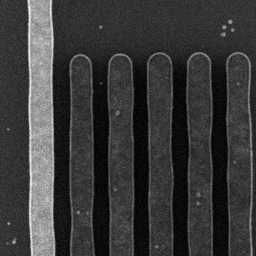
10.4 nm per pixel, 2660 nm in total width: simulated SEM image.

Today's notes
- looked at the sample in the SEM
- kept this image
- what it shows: groups of lines, slits or small figures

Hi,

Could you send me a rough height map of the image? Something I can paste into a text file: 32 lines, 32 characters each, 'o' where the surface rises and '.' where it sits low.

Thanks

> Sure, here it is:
....oo..........................
....oo..........................
....oo..........................
....oo..........................
....ooo.........................
....ooo.........................
....ooo.........................
....ooo..oo...oo...oo...oo..ooo.
....oo...oo...ooo..oo...oo..ooo.
....oo...oo...ooo..oo...oo..ooo.
....oo...oo...ooo..oo...oo..ooo.
....oo...oo...ooo..oo..ooo..ooo.
....oo...oo...ooo..oo..ooo..ooo.
....ooo..oo...ooo..oo...oo..ooo.
....ooo..ooo..ooo..oo...oo..ooo.
....ooo..ooo..ooo..oo...oo..ooo.
....ooo..ooo..ooo..oo...oo..ooo.
....ooo..ooo..ooo..oo...oo..ooo.
....ooo..ooo..ooo..oo...oo...oo.
....ooo..ooo..ooo..oo...oo...oo.
....ooo..ooo..ooo..oo...oo...oo.
....ooo..ooo..ooo..ooo..oo..ooo.
....ooo..ooo..ooo..ooo..oo..ooo.
....ooo..ooo..ooo..ooo..oo...oo.
....ooo..ooo..ooo..oo...oo...oo.
....ooo..ooo..ooo..oo...oo...oo.
....ooo..ooo..ooo..oo...oo...oo.
....ooo..oo...ooo..oo...oo...oo.
....ooo..ooo..ooo..oo...oo...oo.
....ooo..ooo..ooo..oo...oo...oo.
....ooo..ooo..ooo..oo...oo...oo.
....ooo..ooo..ooo..oo...oo...oo.